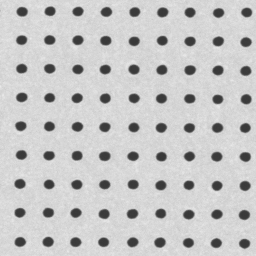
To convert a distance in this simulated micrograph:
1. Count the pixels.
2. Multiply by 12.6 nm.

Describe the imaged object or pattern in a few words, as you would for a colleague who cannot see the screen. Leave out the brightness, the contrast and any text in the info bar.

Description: a regular array of holes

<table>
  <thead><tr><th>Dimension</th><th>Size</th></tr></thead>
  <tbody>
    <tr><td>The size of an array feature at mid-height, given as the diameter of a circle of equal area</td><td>0.133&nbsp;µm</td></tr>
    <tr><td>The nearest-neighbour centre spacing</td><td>0.351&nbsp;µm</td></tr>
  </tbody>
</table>